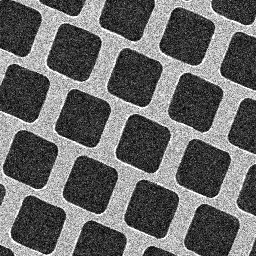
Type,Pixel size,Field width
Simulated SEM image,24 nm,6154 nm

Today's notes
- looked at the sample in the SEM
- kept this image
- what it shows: a regular array of holes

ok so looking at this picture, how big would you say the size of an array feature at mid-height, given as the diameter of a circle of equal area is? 1290 nm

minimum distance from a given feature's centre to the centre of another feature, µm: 1.58